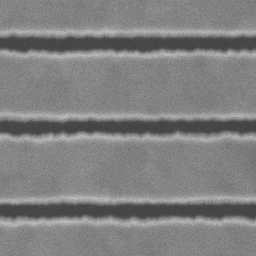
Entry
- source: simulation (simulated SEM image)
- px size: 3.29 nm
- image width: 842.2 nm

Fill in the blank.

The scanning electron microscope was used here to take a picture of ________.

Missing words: lines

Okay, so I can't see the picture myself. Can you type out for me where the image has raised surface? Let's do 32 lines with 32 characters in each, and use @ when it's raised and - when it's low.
@@@@@@@@@@@@@@@@@@@@@@@@@@@@@@@@
@@@@@@@@@@@@@@@@@@@@@@@@@@@@@@@@
@@@@@@@@@@@@@@@@@@@@@@@@@@@@@@@@
@@@@@@@@@@@@@@@@@@@@@@@@@@@@@@@@
--------------------------------
--------------------------------
@-----------------------@@@---@-
@@@@@@@@@@@@@@@@@@@@@@@@@@@@@@@@
@@@@@@@@@@@@@@@@@@@@@@@@@@@@@@@@
@@@@@@@@@@@@@@@@@@@@@@@@@@@@@@@@
@@@@@@@@@@@@@@@@@@@@@@@@@@@@@@@@
@@@@@@@@@@@@@@@@@@@@@@@@@@@@@@@@
@@@@@@@@@@@@@@@@@@@@@@@@@@@@@@@@
@@@@@@@@@@@@@@@@@@@@@@@@@@@@@@@@
@@@@@@@@@@@@@@@@@@@@@@@@@@@@@@@@
--------------------------------
--------------------------------
@@@@@@@@@@@@@@@@@@@@@@@@@@@@@@@@
@@@@@@@@@@@@@@@@@@@@@@@@@@@@@@@@
@@@@@@@@@@@@@@@@@@@@@@@@@@@@@@@@
@@@@@@@@@@@@@@@@@@@@@@@@@@@@@@@@
@@@@@@@@@@@@@@@@@@@@@@@@@@@@@@@@
@@@@@@@@@@@@@@@@@@@@@@@@@@@@@@@@
@@@@@@@@@@@@@@@@@@@@@@@@@@@@@@@@
@@@@@@@@@@@@@@@@@@@@@@@@@@@@@@@@
--------------------------------
--------------------------------
--@--@-@@@@@-@------@@@@@@--@@@-
@@@@@@@@@@@@@@@@@@@@@@@@@@@@@@@@
@@@@@@@@@@@@@@@@@@@@@@@@@@@@@@@@
@@@@@@@@@@@@@@@@@@@@@@@@@@@@@@@@
@@@@@@@@@@@@@@@@@@@@@@@@@@@@@@@@